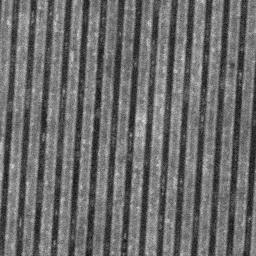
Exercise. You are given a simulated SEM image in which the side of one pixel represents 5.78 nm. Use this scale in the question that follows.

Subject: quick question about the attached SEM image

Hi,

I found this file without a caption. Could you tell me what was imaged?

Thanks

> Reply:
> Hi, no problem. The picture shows parallel lines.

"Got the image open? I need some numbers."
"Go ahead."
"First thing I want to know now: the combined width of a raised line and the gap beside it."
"101 nanometres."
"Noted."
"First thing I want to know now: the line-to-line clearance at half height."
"44 nm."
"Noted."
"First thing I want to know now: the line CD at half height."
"0.0584 microns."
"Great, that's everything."